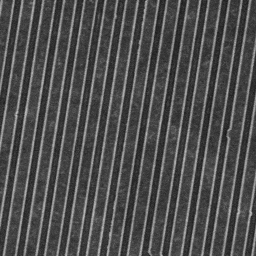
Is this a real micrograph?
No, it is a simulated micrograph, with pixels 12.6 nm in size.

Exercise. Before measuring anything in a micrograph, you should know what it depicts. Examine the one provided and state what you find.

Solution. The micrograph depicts parallel lines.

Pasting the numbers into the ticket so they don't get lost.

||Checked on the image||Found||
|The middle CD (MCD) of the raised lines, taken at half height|161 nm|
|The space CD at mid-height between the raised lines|103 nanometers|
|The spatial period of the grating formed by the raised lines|259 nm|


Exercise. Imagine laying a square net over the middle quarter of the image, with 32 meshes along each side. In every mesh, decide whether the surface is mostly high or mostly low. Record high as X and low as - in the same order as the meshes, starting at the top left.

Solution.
---XXX--XXX--XXX--XXX--XXX--XXX-
--XXXX--XXX--XXX--XXX--XXX--XXX-
--XXX---XX---XXX--XXX--XXX--XXX-
--XXX--XXX--XXXX--XXX--XXX--XXX-
--XXX--XXX--XXX---XX---XXX--XXX-
--XXX--XXX--XXX--XXX---XXX--XXX-
--XXX--XXX--XXX--XXX--XXX--XXXX-
-XXXX--XXX--XXX--XXX--XXX--XXX--
-XXX---XX---XXX--XXX--XXX--XXX--
-XXX--XXX---XXX--XXX--XXX--XXX--
-XXX--XXX--XXX---XXX--XXX--XXX--
-XXX--XXX--XXX---XX---XXX--XXX--
-XXX--XXX--XXX--XXX--XXXX--XXX--
-XXX--XXX--XXX--XXX--XXX--XXX---
XXX---XXX--XXX--XXX--XXX--XXX---
XXX---XX---XXX--XXX--XXX--XXX--X
XXX--XXX--XXXX--XXX--XXX--XXX--X
XXX--XXX--XXX---XX---XXX--XXX--X
XXX--XXX--XXX--XXX---XXX--XXX--X
XXX--XXX--XXX--XXX--XXX--XXXX--X
XXX--XXX--XXX--XXX--XXX--XXX---X
XX---XX---XXX--XXX--XXX--XXX--XX
XX--XXX---XXX--XXX--XXX--XXX--XX
XX--XXX--XXX---XXX--XXX--XXX--XX
XX--XXX--XXX---XX---XXX--XXX--XX
XX--XXX--XXX--XXX--XXXX--XXX--XX
XX--XXX--XXX--XXX--XXX--XXX---XX
X---XXX--XXX--XXX--XXX--XXX---XX
X---XX---XXX--XXX--XXX--XXX--XXX
X--XXX--XXXX--XXX--XXX--XXX--XXX
X--XXX--XXX---XX---XXX--XXX--XXX
X--XXX--XXX--XXX---XXX--XXX--XXX